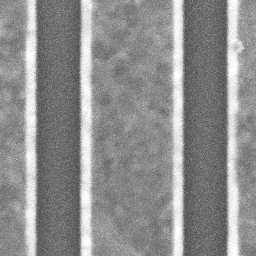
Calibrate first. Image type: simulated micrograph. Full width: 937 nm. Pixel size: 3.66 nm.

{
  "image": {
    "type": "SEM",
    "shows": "one or a few lines or trenches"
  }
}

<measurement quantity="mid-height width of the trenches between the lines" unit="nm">191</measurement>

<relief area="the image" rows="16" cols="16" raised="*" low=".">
**...******....*
**...******....*
**...******...**
**...******...**
**...******....*
**...******....*
**...******....*
**...******....*
**...******....*
**...******...**
**...******....*
**...******....*
**...******....*
**...******....*
**...******....*
**...******....*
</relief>